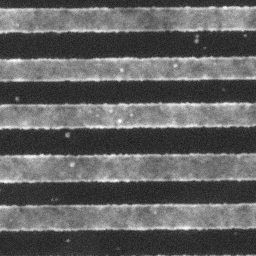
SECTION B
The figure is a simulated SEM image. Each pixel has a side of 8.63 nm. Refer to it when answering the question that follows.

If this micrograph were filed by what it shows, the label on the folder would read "lines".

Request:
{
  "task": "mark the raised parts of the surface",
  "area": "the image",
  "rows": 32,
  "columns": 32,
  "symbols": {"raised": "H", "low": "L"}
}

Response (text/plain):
LLLLLLLLLLLLLLLLLLLLLLLLLLLLLLLL
HHHHHHHHHHHHHHHHHHHHHHHHHHHHHHHH
HHHHHHHHHHHHHHHHHHHHHHHHHHHHHHHH
HHHHHHHHHHHHHHHHHHHHHHHHHHHHHHHH
LLLLLLLLLLLLLLLLLLLLLLLLLLLLLLLL
LLLLLLLLLLLLLLLLLLLLLLLLLLLLLLLL
LLLLLLLLLLLLLLLLLLLLLLLLLLLLLLLL
HHHHHHHHHHHHHHHHHHHHHHHHHHHHHHHH
HHHHHHHHHHHHHHHHHHHHHHHHHHHHHHHH
HHHHHHHHHHHHHHHHHHHHHHHHHHHHHHHH
LLLLLLLLLLLLLLLLLLLLLLLLLLLLLLLL
LLLLLLLLLLLLLLLLLLLLLLLLLLLLLLLL
LLLLLLLLLLLLLLLLLLLLLLLLLLLLLLLL
HHHHHHHHHHHHHHHHHHHHHHHHHHHHHHHH
HHHHHHHHHHHHHHHHHHHHHHHHHHHHHHHH
HHHHHHHHHHHHHHHHHHHHHHHHHHHHHHHH
LLLLLLLLLLLLLLLLLLLLLLLLLLLLLLLL
LLLLLLLLLLLLLLLLLLLLLLLLLLLLLLLL
LLLLLLLLLLLLLLLLLLLLLLLLLLLLLLLL
HHHHHHHHHHHHHHHHHHHHHHHHHHHHHHHH
HHHHHHHHHHHHHHHHHHHHHHHHHHHHHHHH
HHHHHHHHHHHHHHHHHHHHHHHHHHHHHHHH
HHHHHHHHHHHHHHHHHHHHHHHHHHHHLHHL
LLLLLLLLLLLLLLLLLLLLLLLLLLLLLLLL
LLLLLLLLLLLLLLLLLLLLLLLLLLLLLLLL
LLLLLLLLLLLLLLLLLLLLLLLLLLHLHLHH
HHHHHHHHHHHHHHHHHHHHHHHHHHHHHHHH
HHHHHHHHHHHHHHHHHHHHHHHHHHHHHHHH
HHHHHHHHHHHHHHHHHHHHHHHHHHHHHHHL
LLLLLLLLLLLLLLLLLLLLLLLLLLLLLLLL
LLLLLLLLLLLLLLLLLLLLLLLLLLLLLLLL
LLLLLLLLLLLLLLLLLLLLLLLLLLLLLLLL